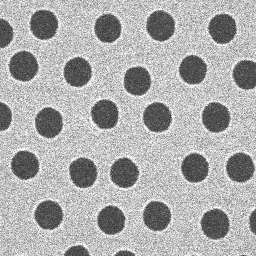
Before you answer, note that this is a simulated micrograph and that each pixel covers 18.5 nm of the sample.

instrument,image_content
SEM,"a regular array of holes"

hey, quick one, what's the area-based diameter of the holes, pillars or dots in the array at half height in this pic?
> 555 nanometres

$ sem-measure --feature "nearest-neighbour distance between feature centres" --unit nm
859